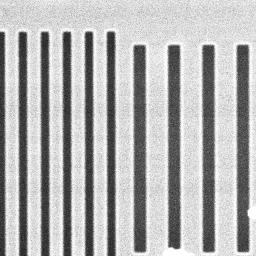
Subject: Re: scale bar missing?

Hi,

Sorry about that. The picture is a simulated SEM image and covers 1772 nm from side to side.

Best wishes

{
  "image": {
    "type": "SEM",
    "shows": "groups of lines, slits or small figures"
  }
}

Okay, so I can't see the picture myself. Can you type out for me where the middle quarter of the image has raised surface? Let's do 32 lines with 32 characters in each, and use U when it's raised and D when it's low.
DDUUUDDDUUUDDUUUUDDDDUUUUUDDDUUU
DDUUUDDDUUUDDUUUUDDDDUUUUUDDDUUU
DDUUUDDDUUUDDUUUUDDDDUUUUUDDDUUU
DDUUUDDDUUUDDUUUUDDDDUUUUUDDDUUU
DDUUUDDDUUUDDUUUUDDDDUUUUUDDDUUU
DDUUUDDDUUUDDUUUUDDDDUUUUUDDDUUU
DDUUUDDDUUUDDUUUUDDDDUUUUUDDDUUU
DDUUUDDDUUUDDUUUUDDDDUUUUUDDDUUU
DDUUUDDDUUUDDUUUUDDDDUUUUUDDDUUU
DDUUUDDDUUUDDUUUUDDDDUUUUUDDDUUU
DDUUUDDDUUUDDUUUUDDDDUUUUUDDDUUU
DDUUUDDDUUUDDUUUUDDDDUUUUUDDDUUU
DDUUUDDDUUUDDUUUUDDDDUUUUUDDDUUU
DDUUUDDDUUUDDUUUUDDDDUUUUUDDDUUU
DDUUUDDDUUUDDUUUUDDDDUUUUUDDDUUU
DDUUUDDDUUUDDUUUUDDDDUUUUUDDDUUU
DDUUUDDDUUUDDUUUUDDDDUUUUUDDDUUU
DDUUUDDDUUUDDUUUUDDDDUUUUUDDDUUU
DDUUUDDDUUUDDUUUUDDDDUUUUUDDDUUU
DDUUUDDDUUUDDUUUUDDDDUUUUUDDDUUU
DDUUUDDDUUUDDUUUUDDDDUUUUUDDDUUU
DDUUUDDDUUUDDUUUUDDDDUUUUUDDDUUU
DDUUUDDDUUUDDUUUUDDDDUUUUUDDDUUU
DDUUUDDDUUUDDUUUUDDDDUUUUUDDDUUU
DDUUUDDDUUUDDUUUUDDDDUUUUUDDDUUU
DDUUUDDDUUUDDUUUUDDDDUUUUUDDDUUU
DDUUUDDDUUUDDUUUUDDDDUUUUUDDDUUU
DDUUUDDDUUUDDUUUUDDDDUUUUUDDDUUU
DDUUUDDDUUUDDUUUUDDDDUUUUUDDDUUU
DDUUUDDDUUUDDUUUUDDDDUUUUUDDDUUU
DDUUUDDDUUUDDUUUUDDDDUUUUUDDDUUU
DDUUUDDDUUUDDUUUUDDDDUUUUUDDDUUU